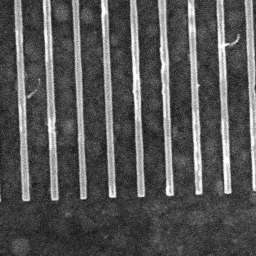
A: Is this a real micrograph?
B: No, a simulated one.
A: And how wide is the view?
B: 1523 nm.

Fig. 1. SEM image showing parallel lines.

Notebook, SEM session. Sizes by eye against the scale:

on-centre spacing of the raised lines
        0.171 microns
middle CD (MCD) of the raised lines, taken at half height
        36.4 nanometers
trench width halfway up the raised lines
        135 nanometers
